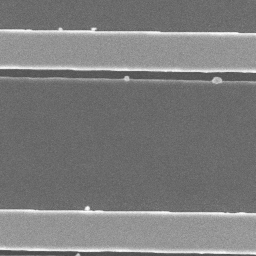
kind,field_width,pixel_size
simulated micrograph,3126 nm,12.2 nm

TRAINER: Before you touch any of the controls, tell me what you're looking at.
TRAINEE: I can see lines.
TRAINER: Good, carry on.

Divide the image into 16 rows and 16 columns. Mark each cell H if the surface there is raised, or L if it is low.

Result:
LLLLLLLLLLLLLLLL
LLLLLLLLLLLLLLLL
HHHHHHHHHHHHHHHH
HHHHHHHHHHHHHHHH
LLLLLLLLLLLLLLLH
LLLLLLLLLLLLLLLL
LLLLLLLLLLLLLLLL
LLLLLLLLLLLLLLLL
LLLLLLLLLLLLLLLL
LLLLLLLLLLLLLLLL
LLLLLLLLLLLLLLLL
LLLLLLLLLLLLLLLL
LLLLLLLLLLLLLLLL
HHHHHHHHHHHHHHHH
HHHHHHHHHHHHHHHH
HHHHHHHHHHHHHHHH